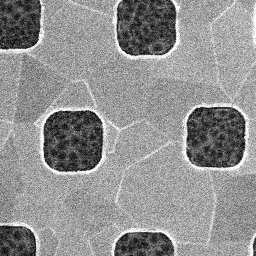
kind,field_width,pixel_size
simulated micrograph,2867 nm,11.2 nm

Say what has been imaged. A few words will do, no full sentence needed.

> holes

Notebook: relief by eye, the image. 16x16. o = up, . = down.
...oooo....ooooo
...oooo....ooooo
..ooooo....ooooo
oooooooo.ooooooo
oooooooooooooooo
oooooooooooooooo
oooooooooooooooo
ooo...oooooo...o
ooo...oooooo...o
ooo...oooooo...o
ooo...oooooooooo
oooooooooooooooo
oooooooooooooooo
oooooooooooooooo
..oooooo..oooooo
..ooooo....ooooo